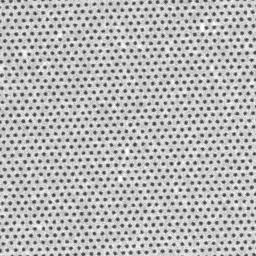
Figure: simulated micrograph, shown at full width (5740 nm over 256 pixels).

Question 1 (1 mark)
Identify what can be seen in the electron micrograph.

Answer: a regular array of holes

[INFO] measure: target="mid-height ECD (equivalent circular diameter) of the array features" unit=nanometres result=104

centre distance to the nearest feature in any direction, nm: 167